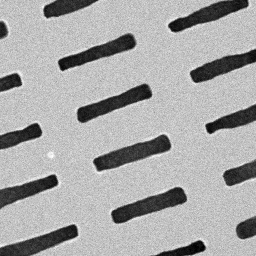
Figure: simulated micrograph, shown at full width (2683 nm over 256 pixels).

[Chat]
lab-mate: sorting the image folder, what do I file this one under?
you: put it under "holes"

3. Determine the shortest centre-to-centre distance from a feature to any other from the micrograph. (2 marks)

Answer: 0.56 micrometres